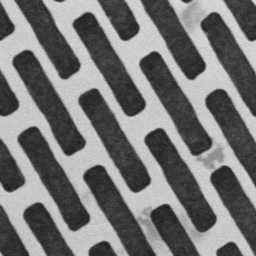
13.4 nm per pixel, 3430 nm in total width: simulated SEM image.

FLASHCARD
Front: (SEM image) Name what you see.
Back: holes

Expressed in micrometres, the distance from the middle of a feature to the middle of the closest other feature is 0.959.